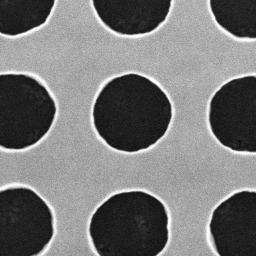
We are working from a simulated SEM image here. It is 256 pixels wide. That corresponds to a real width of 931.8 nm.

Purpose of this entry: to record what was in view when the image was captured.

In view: holes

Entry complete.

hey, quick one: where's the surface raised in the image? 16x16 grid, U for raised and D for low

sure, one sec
DDDUUUDDDDDUUDDD
DDDUUUUDDDUUUUDD
UUUUUUUUUUUUUUUU
UUUUUUUUUUUUUUUU
UUUUUUUUUUUUUUUU
DDDUUUDDDDUUUUDD
DDDUUUDDDDDUUDDD
DDDUUUDDDDDUUDDD
DDDUUUDDDDUUUDDD
UUUUUUUUUUUUUUUU
UUUUUUUUUUUUUUUU
UUUUUUUUUUUUUUUU
DDDUUUUDDDUUUUDD
DDDUUUDDDDUUUDDD
DDDUUUDDDDDUUDDD
DDDUUUDDDDUUUDDD